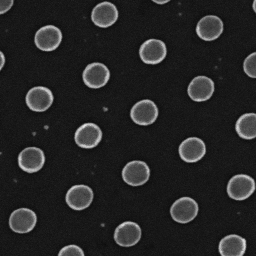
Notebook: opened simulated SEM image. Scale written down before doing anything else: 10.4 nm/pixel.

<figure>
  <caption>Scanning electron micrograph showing a regular array of raised bodies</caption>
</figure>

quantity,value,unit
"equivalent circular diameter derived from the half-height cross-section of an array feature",25.2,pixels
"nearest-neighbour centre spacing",632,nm